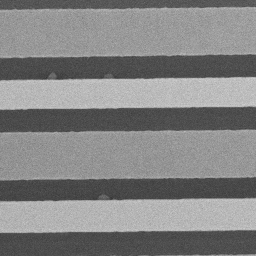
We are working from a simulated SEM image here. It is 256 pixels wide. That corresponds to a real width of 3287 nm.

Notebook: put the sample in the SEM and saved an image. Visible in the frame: lines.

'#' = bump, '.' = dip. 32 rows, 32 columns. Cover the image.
................................
################################
################################
################################
################################
################################
################################
................................
................................
................................
################################
################################
################################
###############.................
................................
................................
...#...#########################
################################
################################
################################
################################
################################
................................
................................
................................
################################
################################
################################
################################
................................
................................
................................